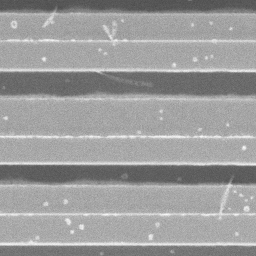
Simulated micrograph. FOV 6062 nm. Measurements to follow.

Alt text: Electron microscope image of lines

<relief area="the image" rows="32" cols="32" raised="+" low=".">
................................
................................
++++++++++++++++++++++++++++++++
++++++++++++++++++++++++++++++++
++++++++++++++++++++++++++++++++
++++++++++++++++++++++++++++++++
++++++++++++++++++++++++++++++++
++++++++++++++++++++++++++++++++
++++++++++++++++++++++++++++++++
................................
................................
................................
++++++++++++++++++++++++++++++++
++++++++++++++++++++++++++++++++
++++++++++++++++++++++++++++++++
++++++++++++++++++++++++++++++++
++++++++++++++++++++++++++++++++
++++++++++++++++++++++++++++++++
++++++++++++++++++++++++++++++++
++++++++++++++++++++++++++++++++
......................+.+++.++++
................................
................................
++++++++++++++++++++++++++++++++
++++++++++++++++++++++++++++++++
++++++++++++++++++++++++++++++++
++++++++++++++++++++++++++++++++
++++++++++++++++++++++++++++++++
++++++++++++++++++++++++++++++++
++++++++++++++++++++++++++++++++
++++++++++++++++++++++++++++++++
................................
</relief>